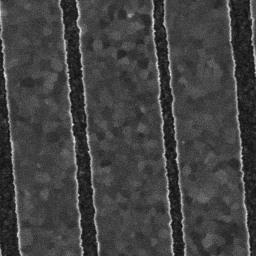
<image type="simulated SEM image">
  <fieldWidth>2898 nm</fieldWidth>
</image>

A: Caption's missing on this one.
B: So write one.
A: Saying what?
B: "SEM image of one or a few lines or trenches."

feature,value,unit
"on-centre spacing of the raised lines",0.933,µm